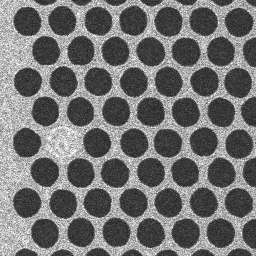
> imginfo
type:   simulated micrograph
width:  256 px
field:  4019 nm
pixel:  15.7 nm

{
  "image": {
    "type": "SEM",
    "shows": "a regular array of holes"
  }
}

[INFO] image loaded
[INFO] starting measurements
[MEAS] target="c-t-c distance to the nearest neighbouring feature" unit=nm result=539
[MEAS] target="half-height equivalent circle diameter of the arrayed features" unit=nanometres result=453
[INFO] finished